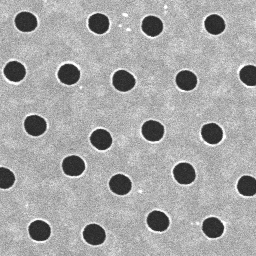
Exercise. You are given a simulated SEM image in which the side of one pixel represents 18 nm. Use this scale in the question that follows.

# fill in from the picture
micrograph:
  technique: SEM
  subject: a regular array of holes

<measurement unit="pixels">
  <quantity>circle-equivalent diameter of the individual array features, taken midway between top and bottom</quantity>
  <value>22.1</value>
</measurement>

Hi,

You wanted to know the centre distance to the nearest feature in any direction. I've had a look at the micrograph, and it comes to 53.4 pixels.